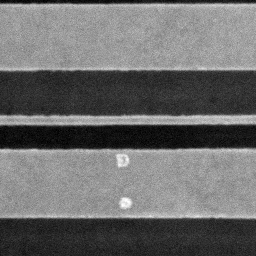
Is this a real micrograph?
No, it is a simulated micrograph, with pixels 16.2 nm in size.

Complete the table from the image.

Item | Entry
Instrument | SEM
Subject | lines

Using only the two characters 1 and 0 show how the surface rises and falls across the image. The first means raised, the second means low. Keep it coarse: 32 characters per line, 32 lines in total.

00000000000000000010100000000001
11111111111111111111111111111111
11111111111111111111111111111111
11111111111111111111111111111111
11111111111111111111111111111111
11111111111111111111111111111111
11111111111111111111111111111111
11111111111111111111111111111111
11111111111111111111111111111111
00000000000000000000000000000000
00000000000000000000000000000000
00000000000000000000000000000000
00000000000000000000000000000000
00000000000000000000000000000000
00000000000000000000000000000001
00000000000000000000000000000000
00000000000000000000000000000000
00000000000000000000000000000000
00000000000000000000000000000000
11111111111111111111111111111111
11111111111111111111111111111111
11111111111111111111111111111111
11111111111111111111111111111111
11111111111111111111111111111111
11111111111111111111111111111111
11111111111111111111111111111111
11111111111111111111111111111111
00000000000000000000000000000000
00000000000000000000000000000000
00000000000000000000000000000000
00000000000000000000000000000000
00000000000000000000000000000000